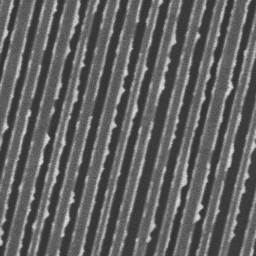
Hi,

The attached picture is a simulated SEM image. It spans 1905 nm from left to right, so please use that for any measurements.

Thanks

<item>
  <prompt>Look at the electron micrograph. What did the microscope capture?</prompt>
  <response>parallel lines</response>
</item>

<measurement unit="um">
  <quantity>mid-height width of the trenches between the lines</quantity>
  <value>0.0624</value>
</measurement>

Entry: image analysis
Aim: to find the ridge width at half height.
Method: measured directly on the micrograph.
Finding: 91.3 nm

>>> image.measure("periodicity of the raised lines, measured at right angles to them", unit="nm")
154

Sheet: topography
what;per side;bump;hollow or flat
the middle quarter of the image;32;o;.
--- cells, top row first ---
..ooo..ooo..oooo..ooo..ooo...ooo
..oo..oooo..oooo..ooo.oooo..ooo.
..oo..ooo...oooo..oo..ooo...ooo.
.ooo..ooo..oooo...oo..ooo...ooo.
.ooo..ooo..oooo..oo...ooo...ooo.
.ooo.oooo..oooo..oo..oooo..oooo.
.oo..oooo..oooo..oo..oooo..ooo..
ooo..ooo...oooo.ooo..ooo...ooo..
ooo..ooo..oooo..oo...ooo...ooo..
ooo..ooo..oooo..oo..ooo...oooo..
oo..oooo..ooo...oo..ooo...ooo...
oo..ooo...ooo...oo..ooo...ooo...
oo..ooo..oooo..ooo..ooo...ooo..o
oo..ooo..oooo..oo..oooo..oooo..o
o..oooo..oooo..oo..ooo...oooo..o
o..ooo...oooo..oo..ooo...ooo...o
o..ooo..oooo..ooo..ooo...ooo..oo
...ooo..oooo..oo..oooo...ooo..oo
..oooo..oooo..oo..ooo...oooo..oo
..ooo...ooo..ooo..ooo...ooo...oo
..ooo..oooo..ooo..ooo...ooo..ooo
..ooo..oooo..oo...ooo...oo...ooo
.oooo..oooo..oo..ooo...ooo...oo.
.ooo...ooo..ooo..ooo...ooo..ooo.
.ooo..oooo..ooo..ooo...ooo..ooo.
.ooo..oooo..oo...ooo...oo...ooo.
oooo..oooo..oo..oooo..ooo...ooo.
ooo...ooo..ooo..ooo...ooo..oooo.
ooo..oooo..ooo..ooo...ooo..oooo.
ooo..oooo..oo...ooo...ooo..oooo.
ooo..oooo..oo..ooo...ooo...ooo.o
ooo..ooo...oo..ooo...ooo...oo..o